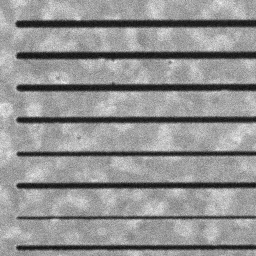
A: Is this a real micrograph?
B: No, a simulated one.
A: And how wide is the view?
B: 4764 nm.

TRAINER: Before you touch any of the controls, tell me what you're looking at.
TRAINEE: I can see parallel lines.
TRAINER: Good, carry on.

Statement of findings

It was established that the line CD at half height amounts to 461 nm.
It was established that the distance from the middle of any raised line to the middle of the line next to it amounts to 594 nm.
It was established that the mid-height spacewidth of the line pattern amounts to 0.126 microns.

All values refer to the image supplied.